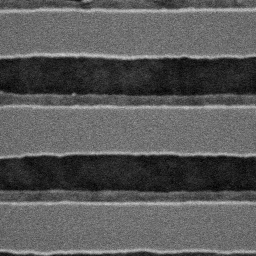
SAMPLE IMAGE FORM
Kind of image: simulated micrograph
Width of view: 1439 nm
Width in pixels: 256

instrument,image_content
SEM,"lines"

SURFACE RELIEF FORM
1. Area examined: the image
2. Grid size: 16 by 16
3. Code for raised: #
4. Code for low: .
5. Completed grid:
################
################
################
################
................
................
################
################
################
################
................
................
################
################
################
################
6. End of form